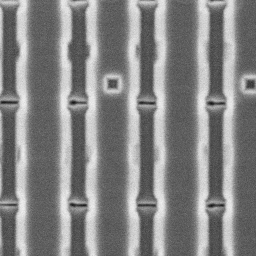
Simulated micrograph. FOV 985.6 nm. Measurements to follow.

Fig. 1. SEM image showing wiring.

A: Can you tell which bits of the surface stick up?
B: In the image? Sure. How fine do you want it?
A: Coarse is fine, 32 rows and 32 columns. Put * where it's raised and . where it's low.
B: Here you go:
...*****...******...*****....***
...*****...******...******...***
...*****...******...******..****
...*****...******...******..****
...*****...******...******..****
...*****...******...*****....***
...*****....*****...*****....***
...*****...******...*****....***
...*****...******...******..****
...*****...******...******..****
...*****...***.**...******..***.
...*****...******...******..****
...*****...******...*****....***
...*****...******...*****....***
...*****...******...******..****
...*****...******...******..****
...*****...******...******..****
...*****...******...******..****
...*****...******...*****...****
...*****...******...*****....***
...*****...******...*****...****
...*****...******...*****...****
...*****...******...******..****
..******...******...******..****
...*****...******...******..****
...*****...******...*****....***
...*****...******...*****...****
...*****...******...*****...****
...*****...******...*****...****
...*****...******...*****...****
...*****...******...*****...****
...*****...******...*****....***